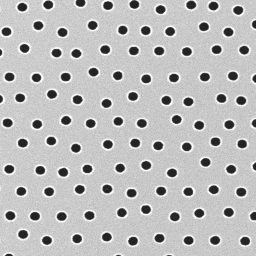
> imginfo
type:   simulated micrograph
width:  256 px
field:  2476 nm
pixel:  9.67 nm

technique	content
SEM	a regular array of holes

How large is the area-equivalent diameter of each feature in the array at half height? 91.3 nm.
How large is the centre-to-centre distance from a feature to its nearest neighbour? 224 nanometers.